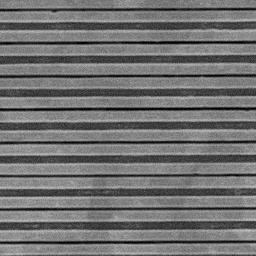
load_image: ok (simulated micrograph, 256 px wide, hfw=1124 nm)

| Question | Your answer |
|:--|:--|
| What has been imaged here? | parallel lines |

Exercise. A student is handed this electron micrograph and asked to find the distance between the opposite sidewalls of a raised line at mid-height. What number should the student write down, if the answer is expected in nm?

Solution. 43.9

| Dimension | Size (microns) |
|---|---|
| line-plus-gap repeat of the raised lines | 0.073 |